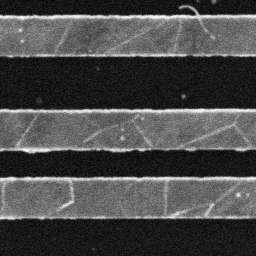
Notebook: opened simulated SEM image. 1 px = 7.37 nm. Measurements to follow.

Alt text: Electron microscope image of lines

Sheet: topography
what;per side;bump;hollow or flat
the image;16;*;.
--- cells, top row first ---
................
****************
****************
**..............
................
................
................
****************
****************
................
................
****************
****************
****************
................
................